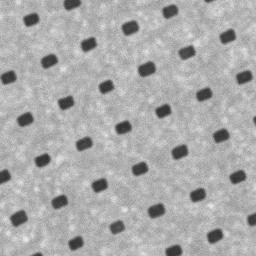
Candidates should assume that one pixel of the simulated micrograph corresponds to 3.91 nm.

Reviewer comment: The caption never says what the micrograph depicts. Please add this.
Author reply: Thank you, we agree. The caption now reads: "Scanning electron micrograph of a regular array of holes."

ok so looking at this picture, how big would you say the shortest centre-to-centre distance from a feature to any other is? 170 nm